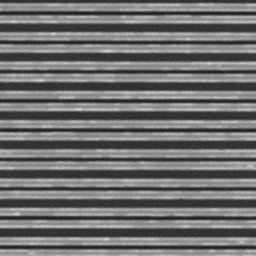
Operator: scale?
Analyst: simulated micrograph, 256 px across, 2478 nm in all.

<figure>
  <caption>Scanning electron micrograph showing parallel lines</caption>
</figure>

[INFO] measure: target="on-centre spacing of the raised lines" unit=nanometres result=142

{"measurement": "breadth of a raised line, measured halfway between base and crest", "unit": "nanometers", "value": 71.4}